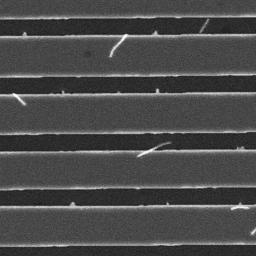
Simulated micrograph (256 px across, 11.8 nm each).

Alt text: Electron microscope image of lines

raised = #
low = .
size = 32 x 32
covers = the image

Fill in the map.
################################
################################
................................
................................
..........######################
################################
################################
################################
################################
#######################.........
................................
................................
################################
################################
################################
################################
###############################.
................................
................................
################################
################################
################################
################################
#############....#..............
................................
................................
################################
################################
################################
################################
################################
................................